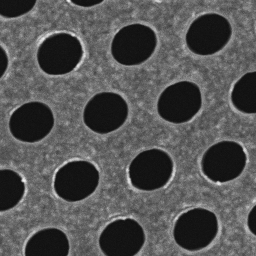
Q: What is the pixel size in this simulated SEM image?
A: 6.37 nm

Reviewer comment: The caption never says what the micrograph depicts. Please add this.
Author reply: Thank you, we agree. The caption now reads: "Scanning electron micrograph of a regular array of holes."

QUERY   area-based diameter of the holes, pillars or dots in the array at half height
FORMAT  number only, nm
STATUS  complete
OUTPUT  272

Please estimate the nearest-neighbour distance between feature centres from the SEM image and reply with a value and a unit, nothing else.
0.468 micrometres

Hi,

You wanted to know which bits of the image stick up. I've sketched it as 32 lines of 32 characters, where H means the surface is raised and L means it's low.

LLLLHHHHHLLLHHHHHHHHHHHHHHHHHHHH
LLLHHHHHHHHHHHHHHHHHHHHHHHHHHHHH
HHHHHHHHHHHHHHHHHHHHHHHHLLLLHHHH
HHHHHHHHHHHHHHHLLLLHHHHHLLLLLHHH
HHHHHHHLLHHHHHLLLLLHHHHLLLLLLHHH
HHHHHLLLLLHHHHLLLLLLHHHLLLLLHHHH
LHHHHLLLLLHHHHLLLLLHHHHHLLLHHHHH
LHHHHLLLLLHHHHLLLLHHHHHHHHHHHHHH
LHHHHLLLLHHHHHHHHHHHHHHHHHHHHHHH
HHHHHHHHHHHHHHHHHHHHHHHHHHHHHHLL
HHHHHHHHHHHHHHHHHHHHHHLLHHHHHHLL
HHHHHHHHHHHHHHHHHHHHLLLLLHHHHLLL
HHHHHHHHHHHLLLLLHHHHLLLLLHHHHLLL
HHLLLLHHHHHLLLLLHHHHLLLLLHHHHHLL
HLLLLLLHHHLLLLLLHHHHLLLLHHHHHHHH
HLLLLLLHHHHLLLLHHHHHHHHHHHHHHHHH
HLLLLLHHHHHHLLHHHHHHHHHHHHHHHHHH
HHLLLHHHHHHHHHHHHHHHHHHHHHHHHHHH
HHHHHHHHHHHHHHHHHHHHHHHHHHLLLLHH
HHHHHHHHHHHHHHHHHLLLLHHHHLLLLLLH
HHHHHHHHLLLHHHHHLLLLLLHHHLLLLLLH
LLHHHHHLLLLLHHHHLLLLLHHHHLLLLLHH
LLLHHHHLLLLLHHHHLLLLLHHHHHHLLHHH
LLLHHHHLLLLLHHHHHLLLHHHHHHHHHHHH
LLLHHHHLLLLHHHHHHHHHHHHHHHHHHHHH
LLHHHHHHHHHHHHHHHHHHHHHHHHHHHHHH
HHHHHHHHHHHHHHHHHHHHHHHLLLHHHHHL
HHHHHHHHHHHHHHHLLHHHHHLLLLLHHHHL
HHHHHHHHHHHHHLLLLLHHHHLLLLLHHHHL
HHHHLLLLHHHHLLLLLLHHHHLLLLLHHHHH
HHHLLLLLLHHHLLLLLLHHHHLLLLHHHHHH
HHHLLLLLLHHHHLLLLHHHHHHHHHHHHHHH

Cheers